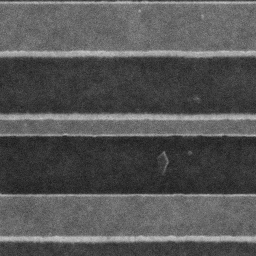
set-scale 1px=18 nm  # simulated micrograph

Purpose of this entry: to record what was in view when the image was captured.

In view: lines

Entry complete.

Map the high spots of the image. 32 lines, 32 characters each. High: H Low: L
HHHHHHHHHHHHHHHHHHHHHHHHHHHHHHHH
HHHHHHHHHHHHHHHHHHHHHHHHHHHHHHHH
HHHHHHHHHHHHHHHHHHHHHHHHHHHHHHHH
HHHHHHHHHHHHHHHHHHHHHHHHHHHHHHHH
HHHHHHHHHHHHHHHHHHHHHHHHHHHHHHHH
HHHHHHHHHHHHHHHHHHHHHHHHHHHHHHHH
HLLHHLHHHLLHHHHHHHHLLLLHHHHLLLLL
LLLLLLLLLLLLLLLLLLLLLLLLLLLLLLLL
LLLLLLLLLLLLLLLLLLLLLLLLLLLLLLLL
LLLLLLLLLLLLLLLLLLLLLLLLLLLLLLLL
LLLLLLLLLLLLLLLLLLLLLLLLLLLLLLLL
LLLLLLLLLLLLLLLLLLLLLLLLLLLLLLLL
LLLLLLLLLLLLLLLLLLLLLLLLLLLLLLLL
LLLLLLLLLLLLLLLLLLLLLLLLLLLLLLLL
LLLLLLLLLLLLLLLLLLLLLLLLLLLLLLLL
HHHHHHHHHHHHHHHHHHHHHHHHHHHHHHHH
HHHHHHHHHHHHHHHHHHHHHHHHHHHHHHHH
LLLLLLLLLLLLLLLLLLLLLLLLLLLLLLLL
LLLLLLLLLLLLLLLLLLLLLLLLLLLLLLLL
LLLLLLLLLLLLLLLLLLLLLLLLLLLLLLLL
LLLLLLLLLLLLLLLLLLLLLLLLLLLLLLLL
LLLLLLLLLLLLLLLLLLLLLLLLLLLLLLLL
LLLLLLLLLLLLLLLLLLLLLLLLLLLLLLLL
LLLLLLLLLLLLLLLLLLLLLLLLLLLLLLLL
HHHHHHHHHHHHHHHHHHHHHHHHHHHHHHHH
HHHHHHHHHHHHHHHHHHHHHHHHHHHHHHHH
HHHHHHHHHHHHHHHHHHHHHHHHHHHHHHHH
HHHHHHHHHHHHHHHHHHHHHHHHHHHHHHHH
HHHHHHHHHHHHHHHHHHHHHHHHHHHHHHHH
HHHHHHHHHHHHHHHHHHHHHHHHHHHHHHHH
LLLLLLLLLLLLLLLLLLLLLLLLLLLLLLLL
LLLLLLLLLLLLLLLLLLLLLLLLLLLLLLLL